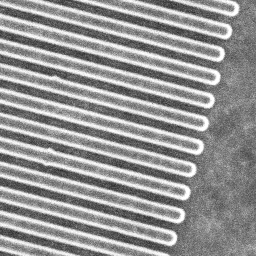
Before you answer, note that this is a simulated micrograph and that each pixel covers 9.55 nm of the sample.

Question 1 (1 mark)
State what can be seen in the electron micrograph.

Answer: parallel lines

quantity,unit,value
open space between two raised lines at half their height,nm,112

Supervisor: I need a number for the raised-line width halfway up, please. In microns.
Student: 0.12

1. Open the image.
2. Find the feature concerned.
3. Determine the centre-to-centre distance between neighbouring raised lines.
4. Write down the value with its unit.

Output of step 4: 226 nanometres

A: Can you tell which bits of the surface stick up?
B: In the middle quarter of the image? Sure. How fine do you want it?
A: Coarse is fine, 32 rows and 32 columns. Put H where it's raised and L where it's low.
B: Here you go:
HHHHHHHHHLLLLLLLLLLLHHHHHHHHHHHH
LHHHHHHHHHHHHLLLLLLLLLLLHHHHHHHH
LLLLLHHHHHHHHHHHHLLLLLLLLLLLHHHH
LLLLLLLLHHHHHHHHHHHHHLLLLLLLLLLL
LLLLLLLLLLLLHHHHHHHHHHHHLLLLLLLL
HHHHLLLLLLLLLLLLHHHHHHHHHHHHLLLL
HHHHHHHHLLLLLLLLLLLLHHHHHHHHHHHH
HHHHHHHHHHHHLLLLLLLLLLLLHHHHHHHH
LLLLHHHHHHHHHHHHLLLLLLLLLLLLHHHH
LLLLLLLLHHHHHHHHHHHHLLLLLLLLLLLH
LLLLLLLLLLLLHHHHHHHHHHHLLLLLLLLL
HHHHLLLLLLLLLLLHHHHHHHHHHHHLLLLL
HHHHHHHHLLLLLLLLLLLLHHHHHHHHHHHL
HHHHHHHHHHHHLLLLLLLLLLLHHHHHHHHH
LLLHHHHHHHHHHHHHLLLLLLLLLLLHHHHH
LLLLLLLHHHHHHHHHHHHLLLLLLLLLLLHH
LLLLLLLLLLLHHHHHHHHHHHHLLLLLLLLL
HHHLLLLLLLLLLLLHHHHHHHHHHHHLLLLL
HHHHHHHLLLLLLLLLLLLHHHHHHHHHHHHL
HHHHHHHHHHHLLLLLLLLLLLHHHHHHHHHH
LLLHHHHHHHHHHHLLLLLLLLLLLLHHHHHH
LLLLLLLHHHHHHHHHHHLLLLLLLLLLLLHH
LLLLLLLLLLLHHHHHHHHHHHLLLLLLLLLL
HHHLLLLLLLLLLLLHHHHHHHHHHHLLLLLL
HHHHHHHLLLLLLLLLLLHHHHHHHHHHHHLL
HHHHHHHHHHLLLLLLLLLLLLHHHHHHHHHH
LLHHHHHHHHHHHHLLLLLLLLLLLLHHHHHH
LLLLLLHHHHHHHHHHHHLLLLLLLLLLLLHH
LLLLLLLLLLHHHHHHHHHHHHLLLLLLLLLL
HHHLLLLLLLLLLHHHHHHHHHHHHHLLLLLL
HHHHHHLLLLLLLLLLLHHHHHHHHHHHHLLL
HHHHHHHHHHLLLLLLLLLLLHHHHHHHHHHL